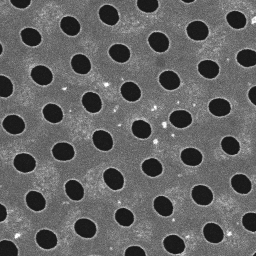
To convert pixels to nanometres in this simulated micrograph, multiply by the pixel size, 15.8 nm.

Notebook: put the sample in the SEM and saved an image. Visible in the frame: a regular array of holes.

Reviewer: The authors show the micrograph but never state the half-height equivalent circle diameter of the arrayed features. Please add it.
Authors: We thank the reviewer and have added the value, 323 nanometers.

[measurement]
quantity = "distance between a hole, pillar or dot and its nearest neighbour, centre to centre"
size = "0.629 µm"